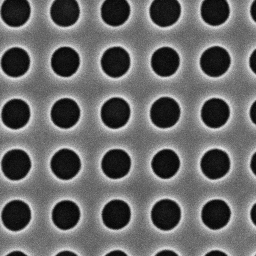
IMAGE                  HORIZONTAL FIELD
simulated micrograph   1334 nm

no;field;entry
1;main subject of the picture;a regular array of holes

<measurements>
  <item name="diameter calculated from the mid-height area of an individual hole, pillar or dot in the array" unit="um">0.159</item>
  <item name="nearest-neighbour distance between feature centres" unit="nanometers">259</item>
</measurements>